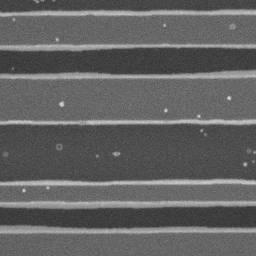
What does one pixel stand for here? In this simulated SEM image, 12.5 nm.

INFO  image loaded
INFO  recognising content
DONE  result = lines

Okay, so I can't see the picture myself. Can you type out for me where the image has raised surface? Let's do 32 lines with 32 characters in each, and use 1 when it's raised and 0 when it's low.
00000000000000000000000000000000
00000000000000000000000000000000
11111111111111111111111111111111
11111111111111111111111111111111
11111111111111111111111111111111
11111111111111111111111111111111
00000000000000000000000000000000
00000000000000000000000000000000
00000000000000000000000000000000
11111111111111111111111111111111
11111111111111111111111111111111
11111111111111111111111111111111
11111111111111111111111111111111
11111111111111111111111111111111
11111111111111111111111111111111
00000000001000000000000000000000
00000000000000000000000000000000
00000000000000000000000000000000
00000000000000000000000000000000
00000000000000000000000000000000
00000000000000000000000000000000
00000000000000000000000000000000
00000000000000000000000000000000
11111111111111111111111111111111
11111111111111111111111111111111
11111111111111111111111111101010
00000000000000000000000000000000
00000000000000000000000000000000
00000000000000000000000000000000
11111111111111111111111111111111
11111111111111111111111111111111
11111111111111111111111111111111